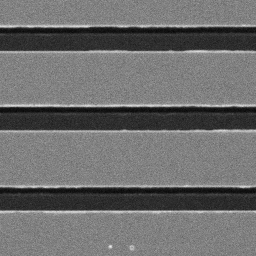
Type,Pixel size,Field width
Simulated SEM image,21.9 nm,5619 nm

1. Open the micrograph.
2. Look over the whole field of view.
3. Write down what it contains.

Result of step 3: lines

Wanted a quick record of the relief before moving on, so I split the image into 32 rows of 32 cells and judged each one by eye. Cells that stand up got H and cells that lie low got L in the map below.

HHHHHHHHHHHHHHHHHHHHHHHHHHHHHHHH
HHHHHHHHHHHHHHHHHHHHHHHHHHHHHHHH
HHHHHHHHHHHHHHHHHHHHHHHHHHHHHHHH
LLLLLLLLLLLLLLLLLLLLLLLLLLLLLLLL
LLLLLLLLLLLLLLLLLLLLLLLLLLLLLLLL
LLLLLLLLLLLLLLLLLLLLLLLLLLLLLLLL
HHHHHHHHHHHHHHHHHHHHHHHHHHHHHHHH
HHHHHHHHHHHHHHHHHHHHHHHHHHHHHHHH
HHHHHHHHHHHHHHHHHHHHHHHHHHHHHHHH
HHHHHHHHHHHHHHHHHHHHHHHHHHHHHHHH
HHHHHHHHHHHHHHHHHHHHHHHHHHHHHHHH
HHHHHHHHHHHHHHHHHHHHHHHHHHHHHHHH
HHHHHHHHHHHHHHHHHHHHHHHHHHHHHHHH
LLLLLLLLLLLLLLLLLLLLLLLLLLLLLLLL
LLLLLLLLLLLLLLLLLLLLLLLLLLLLLLLL
LLLLLLLLLLLLLLLLLLLLLLLLLLLLLLLL
HHHHHHHHHHHHHHHHHHHHHHHHHHHHHHHH
HHHHHHHHHHHHHHHHHHHHHHHHHHHHHHHH
HHHHHHHHHHHHHHHHHHHHHHHHHHHHHHHH
HHHHHHHHHHHHHHHHHHHHHHHHHHHHHHHH
HHHHHHHHHHHHHHHHHHHHHHHHHHHHHHHH
HHHHHHHHHHHHHHHHHHHHHHHHHHHHHHHH
HHHHHHHHHHHHHHHHHHHHHHHHHHHHHHHH
LLLLLLLLLLLLLLLLLLLLLLLLLLLLLLLL
LLLLLLLLLLLLLLLLLLLLLLLLLLLLLLLL
LLLLLLLLLLLLLLLLLLLLLLLLLLLLLLLL
HHHHHHHHHHHHHHHHHHHHHHHHHHHHHHHH
HHHHHHHHHHHHHHHHHHHHHHHHHHHHHHHH
HHHHHHHHHHHHHHHHHHHHHHHHHHHHHHHH
HHHHHHHHHHHHHHHHHHHHHHHHHHHHHHHH
HHHHHHHHHHHHHHHHHHHHHHHHHHHHHHHH
HHHHHHHHHHHHHHHHHHHHHHHHHHHHHHHH